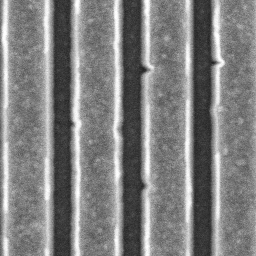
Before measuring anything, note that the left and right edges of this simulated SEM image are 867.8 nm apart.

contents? one or a few lines or trenches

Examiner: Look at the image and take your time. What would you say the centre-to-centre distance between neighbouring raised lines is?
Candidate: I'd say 240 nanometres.